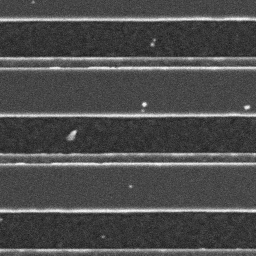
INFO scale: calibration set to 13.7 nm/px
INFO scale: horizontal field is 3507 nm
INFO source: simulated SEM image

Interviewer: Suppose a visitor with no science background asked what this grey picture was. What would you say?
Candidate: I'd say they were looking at lines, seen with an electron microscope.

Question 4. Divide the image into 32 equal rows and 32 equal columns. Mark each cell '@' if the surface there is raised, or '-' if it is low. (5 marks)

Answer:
@@@@@@@@@@@@@@@@@@@@@@@@@@@@@@@@
@@@@@@@@@@@@@@@@@@@@@@@@@@@@@@@@
--------------------------------
--------------------------------
--------------------------------
--------------------------------
--------------------------------
@@@@@@@@@@@@@@@@@@@@@@@@@@@@@@@@
@@@@@@@@@@@@@@@@@@@@@@@@@@@@@@@@
@@@@@@@@@@@@@@@@@@@@@@@@@@@@@@@@
@@@@@@@@@@@@@@@@@@@@@@@@@@@@@@@@
@@@@@@@@@@@@@@@@@@@@@@@@@@@@@@@@
@@@@@@@@@@@@@@@@@@@@@@@@@@@@@@@@
@@@@@@@@@@@@@@@@@@@@@@@@@@@@@@@@
--------------------------------
--------------------------------
--------------------------------
--------------------------------
--------------------------------
@@@@@@@@@@@@@@@@@@@@@@@@@@@@@@@@
@@@@@@@@@@@@@@@@@@@@@@@@@@@@@@@@
@@@@@@@@@@@@@@@@@@@@@@@@@@@@@@@@
@@@@@@@@@@@@@@@@@@@@@@@@@@@@@@@@
@@@@@@@@@@@@@@@@@@@@@@@@@@@@@@@@
@@@@@@@@@@@@@@@@@@@@@@@@@@@@@@@@
@@@@@@@@@@@@@@@@@@@@@@@@@@@@@@@@
--------------------------------
--------------------------------
--------------------------------
--------------------------------
--------------------------------
@@@@@@@@@@@@@@@@@@@@@@@@@@@@@@@@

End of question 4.